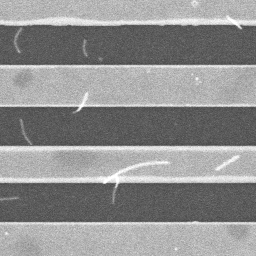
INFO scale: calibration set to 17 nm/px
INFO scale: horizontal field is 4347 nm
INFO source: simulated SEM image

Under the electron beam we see lines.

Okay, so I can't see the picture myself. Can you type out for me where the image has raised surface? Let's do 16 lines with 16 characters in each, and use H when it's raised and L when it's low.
HHHHHHHHHHHHHHHH
HHLLLHHHLLLLLLHL
LLLLLLLLLLLLLLLL
LLLLLLLLLLLLLLLL
HHHHHHHHHHHHHHHH
HHHHHHHHHHHHHHHH
HHHHHHHHHHHHHHHH
LLLLLLLLLLLLLLLL
LLLLLLLLLLLLLLLL
HHHHHHHHHHHHHHHH
HHHHHHHHHHHHHHHH
LLLLLLLLLLLLLLLL
LLLLLLLLLLLLLLLL
LLLLLLLLLLLLLLLL
HHHHHHHHHHHHHHHH
HHHHHHHHHHHHHHHH